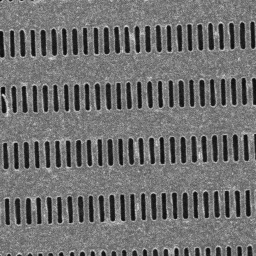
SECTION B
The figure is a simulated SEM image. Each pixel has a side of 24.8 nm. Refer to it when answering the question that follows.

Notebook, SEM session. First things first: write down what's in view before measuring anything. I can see a regular array of holes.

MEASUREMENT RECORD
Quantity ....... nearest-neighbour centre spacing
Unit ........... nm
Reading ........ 257